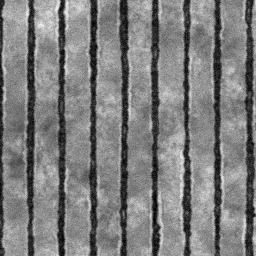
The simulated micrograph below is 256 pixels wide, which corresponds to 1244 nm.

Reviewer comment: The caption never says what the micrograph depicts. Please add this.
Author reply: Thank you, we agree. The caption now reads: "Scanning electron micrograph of parallel lines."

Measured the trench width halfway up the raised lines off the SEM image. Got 34 nanometers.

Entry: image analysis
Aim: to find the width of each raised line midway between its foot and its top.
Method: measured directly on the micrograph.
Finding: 119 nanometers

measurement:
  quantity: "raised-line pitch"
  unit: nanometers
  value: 152